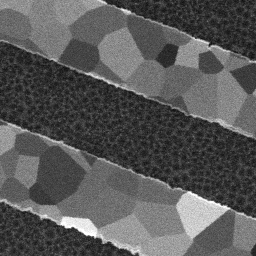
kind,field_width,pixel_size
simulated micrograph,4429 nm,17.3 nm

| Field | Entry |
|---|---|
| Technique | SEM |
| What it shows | one or a few lines or trenches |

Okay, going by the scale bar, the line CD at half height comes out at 1270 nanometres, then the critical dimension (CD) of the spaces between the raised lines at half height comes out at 1290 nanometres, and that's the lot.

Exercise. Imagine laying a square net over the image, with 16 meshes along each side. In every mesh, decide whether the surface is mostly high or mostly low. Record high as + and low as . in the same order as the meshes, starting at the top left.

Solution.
+++++++.........
++++++++++......
++++++++++++....
...++++++++++++.
.....+++++++++++
........++++++++
..........++++++
.............+++
+++.............
+++++...........
++++++++........
++++++++++......
+++++++++++++...
...++++++++++++.
.....+++++++++++
........++++++++